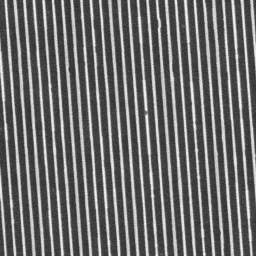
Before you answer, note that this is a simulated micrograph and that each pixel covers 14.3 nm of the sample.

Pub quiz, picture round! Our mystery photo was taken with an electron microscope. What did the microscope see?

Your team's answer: parallel lines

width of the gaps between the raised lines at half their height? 109 nm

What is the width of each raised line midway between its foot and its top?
35.7 nm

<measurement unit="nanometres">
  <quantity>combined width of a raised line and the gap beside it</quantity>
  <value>135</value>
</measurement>